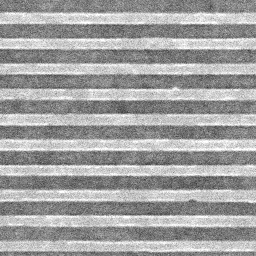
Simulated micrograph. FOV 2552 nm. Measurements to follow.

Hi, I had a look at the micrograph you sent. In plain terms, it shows parallel lines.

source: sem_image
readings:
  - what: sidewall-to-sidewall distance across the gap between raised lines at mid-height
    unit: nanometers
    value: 157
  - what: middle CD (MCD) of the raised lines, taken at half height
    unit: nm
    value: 102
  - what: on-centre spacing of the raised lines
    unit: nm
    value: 252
